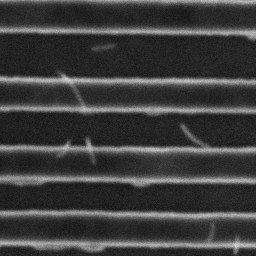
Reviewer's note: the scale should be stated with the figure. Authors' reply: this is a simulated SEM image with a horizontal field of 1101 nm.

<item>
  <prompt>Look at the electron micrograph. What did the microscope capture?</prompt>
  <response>lines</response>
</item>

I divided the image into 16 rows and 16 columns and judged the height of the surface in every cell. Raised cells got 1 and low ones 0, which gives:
1111111111111111
1111111111111111
0000000000000000
0000000000000000
0000000000000000
1111111111111111
1111111111111111
0000000000000000
0000000000000000
1111111111111111
1111111111111111
0000000000000000
0000000000000000
1111111111111111
1111111111111111
0000000000000000